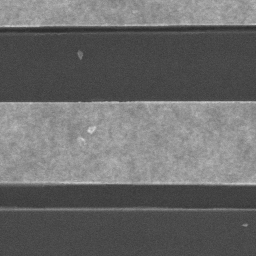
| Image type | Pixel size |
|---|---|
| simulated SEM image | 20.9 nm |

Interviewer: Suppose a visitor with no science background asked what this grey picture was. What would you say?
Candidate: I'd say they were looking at lines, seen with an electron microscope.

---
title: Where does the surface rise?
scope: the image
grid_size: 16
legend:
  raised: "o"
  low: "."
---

oooooooooooooooo
oooooooooooooooo
................
................
................
................
oooooooooooooooo
oooooooooooooooo
oooooooooooooooo
oooooooooooooooo
oooooooooooooooo
................
................
................
................
................